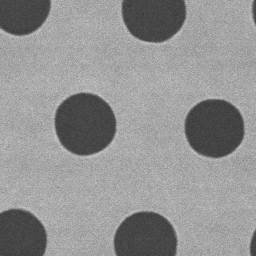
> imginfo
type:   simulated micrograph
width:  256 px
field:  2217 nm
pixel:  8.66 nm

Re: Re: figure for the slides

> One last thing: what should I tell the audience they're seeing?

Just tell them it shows holes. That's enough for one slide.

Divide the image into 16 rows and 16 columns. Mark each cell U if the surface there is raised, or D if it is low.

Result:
DDDUUUUUDDDDUUUU
DDDUUUUUDDDUUUUU
UUUUUUUUUDUUUUUU
UUUUUUUUUUUUUUUU
UUUUUUUUUUUUUUUU
UUUUUUUUUUUUUUUU
UUUUDDDUUUUUDDUU
UUUDDDDUUUUUDDDU
UUUUDDDUUUUUDDDU
UUUUDDUUUUUUDDDU
UUUUUUUUUUUUUUUU
UUUUUUUUUUUUUUUU
UUUUUUUUUUUUUUUU
DDUUUUUUDDUUUUUU
DDDUUUUDDDDUUUUU
DDDUUUUDDDDUUUUU